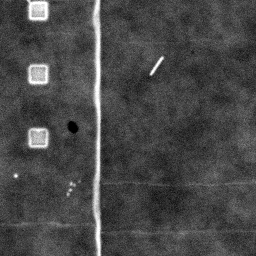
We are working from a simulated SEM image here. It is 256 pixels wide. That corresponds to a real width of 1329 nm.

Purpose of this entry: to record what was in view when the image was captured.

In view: wiring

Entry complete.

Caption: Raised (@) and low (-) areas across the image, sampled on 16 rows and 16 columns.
@@-@@@----------
@@@@@@----------
@@@@@@----------
@@@@@@----------
@@-@@@----------
@@@@@@----------
@@@@@@----------
@@@@@@----------
@@-@@@----------
@@@@@@----------
@@@@@@----------
@@@@@@----------
@@@@@@----------
@@@@@@----------
@@@@@@----------
@@@@@@----------